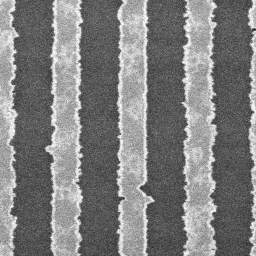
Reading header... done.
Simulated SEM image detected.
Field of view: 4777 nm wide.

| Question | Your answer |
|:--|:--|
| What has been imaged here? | one or a few lines or trenches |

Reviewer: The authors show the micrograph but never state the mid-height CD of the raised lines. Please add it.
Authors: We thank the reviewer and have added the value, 452 nanometres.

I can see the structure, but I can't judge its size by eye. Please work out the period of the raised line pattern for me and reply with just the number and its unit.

1240 nanometres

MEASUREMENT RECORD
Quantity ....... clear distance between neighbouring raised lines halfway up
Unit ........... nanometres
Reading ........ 784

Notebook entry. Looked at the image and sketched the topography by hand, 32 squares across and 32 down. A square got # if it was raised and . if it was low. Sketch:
##.....###.....###.....####.....
#......###.....###.....###.....#
#......###.....###.....###.....#
##.....###.....###......###.....
##.....###.....###.....###......
#......###.....###......###.....
##.....###.....###.....###......
##.....###.....###.....###.....#
##.....###.....###.....###.....#
##.....###.....###.....###.....#
#......###.....###.....###......
#......###.....###.....####....#
##.....###.....###.....###.....#
#......###.....###.....####.....
##.....###.....###.....####.....
##.....###.....###.....###.....#
#......###.....###.....####....#
#......###.....###.....####....#
##....####.....###.....###......
##.....###.....###.....###......
#......###.....###.....###......
##.....###.....###.....###......
##.....###.....###.....###......
##.....###.....##......####.....
##.....###.....###.....###......
##.....###.....###.....####.....
#......###.....###.....###......
##....####.....###.....###......
##.....###.....###.....###......
##.....###.....###.....####.....
#......###.....###.....####.....
##.....###.....###.....####....#